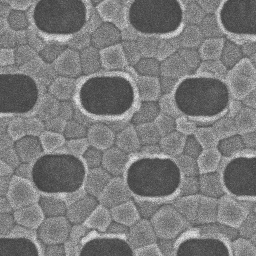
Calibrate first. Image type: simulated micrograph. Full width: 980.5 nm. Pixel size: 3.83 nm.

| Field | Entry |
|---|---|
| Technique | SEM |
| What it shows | holes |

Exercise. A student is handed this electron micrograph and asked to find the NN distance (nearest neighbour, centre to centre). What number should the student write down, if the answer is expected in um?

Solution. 0.355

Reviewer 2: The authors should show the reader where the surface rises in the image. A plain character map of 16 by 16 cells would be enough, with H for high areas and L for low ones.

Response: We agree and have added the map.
HHLLLHHHLLLHHHLL
HHLLLHHHLLLHHHLL
HHHHHHHHHHHHHHHH
HHHHHHHHHHHHHHHH
HHHHHHHHHHHHHHHH
LLHHHLLLHHHLLLHH
LLHHHLLLHHHLLLHH
HHHHHHHHHHHHHHHH
HHHHHHHHHHHHHHHH
HHHHHHHHHHHHHHHH
HHLLLHHHLLLHHHLL
HHLLLHHHLLLHHHLL
HHHHHHHHHHHHHHHH
HHHHHHHHHHHHHHHH
HHHHHHHHHHHHHHHH
LLHHHLLLHHHLLLHH